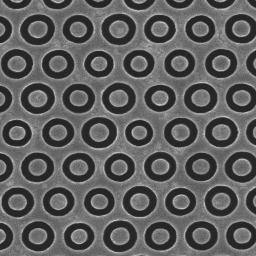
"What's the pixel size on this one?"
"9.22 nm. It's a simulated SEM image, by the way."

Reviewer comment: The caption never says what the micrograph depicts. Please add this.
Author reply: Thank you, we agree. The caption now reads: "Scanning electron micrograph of a regular array of ring-shaped grooves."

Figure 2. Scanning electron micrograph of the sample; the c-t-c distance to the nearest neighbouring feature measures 366 nm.